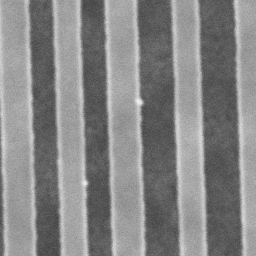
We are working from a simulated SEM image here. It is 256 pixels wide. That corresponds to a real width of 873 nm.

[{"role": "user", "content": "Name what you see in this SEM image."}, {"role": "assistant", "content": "lines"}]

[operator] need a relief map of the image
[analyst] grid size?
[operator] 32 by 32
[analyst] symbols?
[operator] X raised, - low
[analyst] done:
XXXX---XXX---XXXX----XXXX----XXX
XXXX---XXX---XXXX-----XXX----XXX
XXXX---XXX---XXXX-----XXX----XXX
XXXX---XXX---XXXX-----XXX----XXX
XXXX---XXX---XXXX-----XXX----XXX
XXXX---XXX---XXXX-----XXX-----XX
XXXX---XXX---XXXX-----XXX-----XX
XXXX---XXX---XXXX-----XXX-----XX
XXXX---XXX---XXXX-----XXX-----XX
XXXX---XXX---XXXX-----XXX-----XX
XXXX---XXX---XXXX-----XXX-----XX
XXXX---XXX---XXXX-----XXX-----XX
XXXX---XXX----XXXX----XXX-----XX
XXXX---XXX----XXXX----XXX-----XX
XXXX---XXX----XXXX----XXX-----XX
XXXX---XXX----XXX-----XXX-----XX
XXXX---XXX----XXX-----XXX-----XX
XXXX---XXXX---XXXX----XXX-----XX
XXXX---XXXX---XXXX----XXX-----XX
XXXX---XXXX---XXXX----XXX-----XX
XXXX---XXXX---XXXX----XXX-----XX
XXXX---XXXX---XXXX----XXX-----XX
XXXX---XXXX---XXXX----XXX-----XX
XXXX---XXXX---XXXX----XXXX----XX
XXXX---XXXX---XXXX----XXXX----XX
XXXX----XXX---XXXX----XXXX----XX
-XXX---XXXX---XXXX----XXXX----XX
-XXX----XXX---XXXX----XXXX----XX
-XXX----XXX---XXXX-----XXX----XX
-XXXX---XXX---XXXX-----XXX----XX
-XXX----XXX---XXXX-----XXX----XX
-XXXX---XXX---XXXX-----XXX----XX